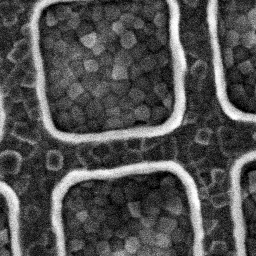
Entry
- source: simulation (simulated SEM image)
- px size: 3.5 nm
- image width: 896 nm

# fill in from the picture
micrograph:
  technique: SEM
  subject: holes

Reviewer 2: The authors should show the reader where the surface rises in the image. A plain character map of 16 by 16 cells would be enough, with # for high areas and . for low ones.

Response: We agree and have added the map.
###........##...
##.........##...
##.........###..
##.........###..
###........###..
###........###..
###........###..
###........#####
####..##########
################
###############.
####........###.
.###........###.
.###........###.
.###........###.
.###........###.